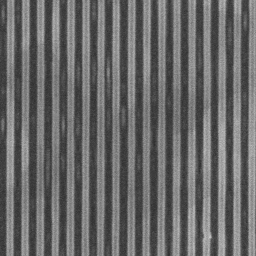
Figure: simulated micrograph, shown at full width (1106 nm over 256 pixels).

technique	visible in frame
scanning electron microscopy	parallel lines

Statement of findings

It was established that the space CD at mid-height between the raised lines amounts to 40 nm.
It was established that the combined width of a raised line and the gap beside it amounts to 65.3 nanometers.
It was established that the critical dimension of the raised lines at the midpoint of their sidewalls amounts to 28.1 nm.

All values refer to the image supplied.